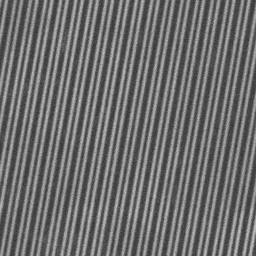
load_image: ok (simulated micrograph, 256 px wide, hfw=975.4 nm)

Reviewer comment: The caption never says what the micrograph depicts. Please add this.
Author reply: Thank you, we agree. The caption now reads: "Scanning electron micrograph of parallel lines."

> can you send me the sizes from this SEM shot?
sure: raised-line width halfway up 8.9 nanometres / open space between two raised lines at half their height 0.0164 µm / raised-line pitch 28.4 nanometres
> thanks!